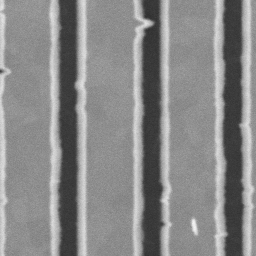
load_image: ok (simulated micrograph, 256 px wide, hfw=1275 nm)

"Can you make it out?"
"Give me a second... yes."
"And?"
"one or a few lines or trenches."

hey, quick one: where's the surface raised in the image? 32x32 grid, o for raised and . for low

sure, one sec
ooooooo...ooooooo....ooooooo...o
ooooooo...ooooooo....oooooo....o
ooooooo...oooooooo...oooooo....o
ooooooo...oooooooo...oooooo....o
ooooooo...oooooooo...oooooo....o
ooooooo...ooooooo....oooooo....o
ooooooo...ooooooo....oooooo....o
ooooooo...ooooooo....oooooo....o
ooooooo...ooooooo....ooooooo...o
ooooooo...ooooooo....oooooo....o
ooooooo...ooooooo....ooooooo...o
ooooooo...ooooooo....oooooo....o
ooooooo...ooooooo....ooooooo...o
ooooooo...ooooooo....ooooooo...o
ooooooo...ooooooo....ooooooo...o
ooooooo...ooooooo....oooooo....o
ooooooo...ooooooo....oooooo....o
ooooooo...ooooooo....oooooo....o
ooooooo...ooooooo....ooooooo...o
ooooooo...ooooooo....ooooooo...o
ooooooo...ooooooo....ooooooo...o
ooooooo...ooooooo....ooooooo...o
ooooooo...ooooooo....ooooooo...o
ooooooo...ooooooo....oooooo....o
ooooooo...ooooooo....oooooo....o
ooooooo...ooooooo....ooooooo...o
ooooooo...ooooooo....oooooo....o
ooooooo...ooooooo....ooooooo...o
ooooooo...ooooooo....ooooooo...o
ooooooo...ooooooo....ooooooo...o
ooooooo...ooooooo....ooooooo...o
ooooooo...ooooooo....ooooooo...o